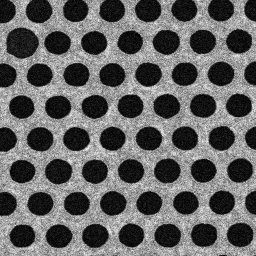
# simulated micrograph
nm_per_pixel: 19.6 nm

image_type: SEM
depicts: a regular array of holes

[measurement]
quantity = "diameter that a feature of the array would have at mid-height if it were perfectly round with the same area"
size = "0.498 um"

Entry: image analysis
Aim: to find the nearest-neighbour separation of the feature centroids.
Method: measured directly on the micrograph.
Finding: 36.2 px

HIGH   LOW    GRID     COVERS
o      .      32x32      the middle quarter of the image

o....ooooo....ooooo.....oooo....
......ooo......ooo......ooo.....
......ooo......ooo.......oo.....
......ooo......ooo......ooo.....
......ooo......oooo.....oooo....
oo...oooooo..ooooooo..ooooooo..o
oooooooooooooooooooooooooooooooo
oooooooooooooooooooooooooooooooo
.ooooo....oooo.....oooo.....oooo
.oooo......oo.......oo.......ooo
..oo.......oo.......oo.......oo.
..oo.......oo.......oo.......ooo
.oooo.....oooo.....oooo.....oooo
ooooooo..ooooooo.oooooooo..ooooo
oooooooooooooooooooooooooooooooo
ooooooooooooooooooooo.oooooooo.o
o....ooooo....ooooo....ooooo....
......ooo......ooo......ooo.....
......ooo......ooo.......oo.....
......ooo......ooo.......oo.....
......ooo......oooo.....oooo....
oo...oooooo..ooooooo...ooooooo.o
oooooooooooooooooooooooooooooooo
oooooooooooooooooooooooooooooooo
.ooooo....ooooo....ooooo....oooo
..ooo......ooo......ooo......ooo
..ooo......oo.......oo.......ooo
..ooo......ooo......ooo......ooo
..ooo......ooo......ooo......ooo
.ooooo....ooooo...oooooo...ooooo
oooooooooooooooooooooooooooooooo
oooooooooooooooooooooooooooooooo